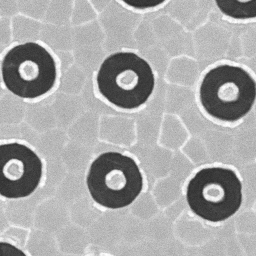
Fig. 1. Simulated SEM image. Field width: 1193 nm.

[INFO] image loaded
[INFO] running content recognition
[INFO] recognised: ring-shaped grooves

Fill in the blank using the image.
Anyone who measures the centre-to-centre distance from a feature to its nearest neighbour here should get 461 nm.